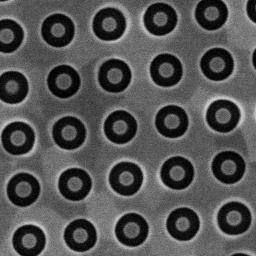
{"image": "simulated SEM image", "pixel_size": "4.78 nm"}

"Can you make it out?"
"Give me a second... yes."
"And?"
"an array of small figures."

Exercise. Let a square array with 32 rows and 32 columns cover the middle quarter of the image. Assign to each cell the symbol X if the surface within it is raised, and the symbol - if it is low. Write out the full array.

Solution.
--XXXXXX--------XXXXX---XXX---XX
---XXXXX----XX---XXXX---XXX---XX
----XXXX---XXX---XXXX---XXX---XX
XX--XXXX---XXX---XXXXX-------XXX
XX--XXXX----XX---XXXXX-------XXX
X---XXXXX-------XXXXXXXX---XXXXX
----XXXXXX-----XXXXXXXXXXXXXXXXX
---XXXXXXXXXXXXXXXXXXXXXXXXXXXXX
-XXXXXXXXXXXXXXXXXXXXXXXXXXXXXXX
XXXXXXXXXXXXXXXXXXXXXXXXXXXXXXXX
XXXXXXXXXXXXXXXXXXXXXXXXX----XXX
XXXXXXXXXXXXX-XXXXXXXXXX------XX
XXXXXXXXXXX------XXXXXX--------X
---XXXXXXX--------XXXXX---XX---X
-----XXXXX---XX---XXXXX--XXXX--X
-X---XXXXX---XX---XXXXX---XX---X
XXX---XXXX---XX---XXXXX--------X
XXX---XXXX--------XXXXXX------XX
XX----XXXXX------XXXXXXXXX--XXXX
-----XXXXXXX----XXXXXXXXXXXXXXXX
----XXXXXXXXXXXXXXXXXXXXXXXXXXXX
---XXXXXXXXXXXXXXXXXXXXXXXXXXXXX
XXXXXXXXXXXXXXXXXXXXXXXXXXXXXXXX
XXXXXXXXXXXXXXXXXXXXXXXXXX-----X
XXXXXXXXXXXXXX----XXXXXXX-------
XXXXXXXXXXXX-------XXXXX--------
-----XXXXXX---------XXXX---XXX--
------XXXXX---XXX---XXXX---XXX--
--X----XXXX---XXX---XXXX---XXX--
-XXX---XXXX---XXX---XXXX--------
-XXX---XXXX--------XXXXXX------X
--X----XXXXX-------XXXXXXXXX-XXX